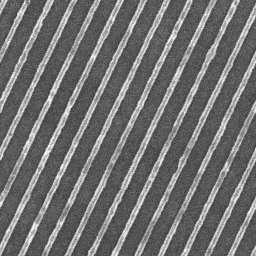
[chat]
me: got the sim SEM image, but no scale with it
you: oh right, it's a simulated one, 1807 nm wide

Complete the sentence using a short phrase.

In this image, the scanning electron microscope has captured parallel lines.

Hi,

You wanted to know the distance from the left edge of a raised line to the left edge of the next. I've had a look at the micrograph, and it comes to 148 nm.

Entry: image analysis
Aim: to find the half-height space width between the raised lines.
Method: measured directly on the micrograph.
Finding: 113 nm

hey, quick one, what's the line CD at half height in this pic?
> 33.4 nm